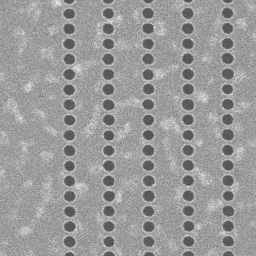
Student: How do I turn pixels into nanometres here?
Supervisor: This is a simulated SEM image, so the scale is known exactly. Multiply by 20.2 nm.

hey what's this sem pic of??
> a regular array of holes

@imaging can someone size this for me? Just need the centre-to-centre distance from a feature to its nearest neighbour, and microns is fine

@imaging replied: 0.301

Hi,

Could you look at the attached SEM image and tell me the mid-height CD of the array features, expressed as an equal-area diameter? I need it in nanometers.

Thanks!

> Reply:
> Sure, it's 231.